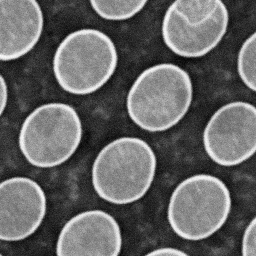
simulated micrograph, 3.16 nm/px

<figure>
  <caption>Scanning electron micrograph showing raised bodies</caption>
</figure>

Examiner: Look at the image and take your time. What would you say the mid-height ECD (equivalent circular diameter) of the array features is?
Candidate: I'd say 190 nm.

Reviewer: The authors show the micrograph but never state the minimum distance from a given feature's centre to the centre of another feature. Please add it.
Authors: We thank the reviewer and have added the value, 257 nanometers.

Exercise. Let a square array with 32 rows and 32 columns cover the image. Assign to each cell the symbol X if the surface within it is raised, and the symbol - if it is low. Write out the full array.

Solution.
XXXX--------XXXXXX----XX-XXX----
XXXXX-------XXXXX----XXXX-XX----
XXXXX----------------XXXXXXX----
XXXXX----------------XXXXXXX----
XXXXX----XXXX--------XXXXXXX----
XXXX----XXXXXX-------XXXXXX----X
XXX----XXXXXXX--------XXXX----XX
-------XXXXXXX----------------XX
-------XXXXXXX-----XXX--------XX
-------XXXXXXX----XXXXX-------XX
--------XXXXX----XXXXXXX-------X
X---------------XXXXXXXX--------
X---------------XXXXXXXX--------
-----XXXX-------XXXXXXX-----XXXX
----XXXXX--------XXXXXX----XXXXX
---XXXXXXX-------XXXXX----XXXXXX
---XXXXXXX----------------XXXXXX
---XXXXXXX-----XX---------XXXXXX
---XXXXXX----XXXXXX-------XXXXXX
---XXXXXX---XXXXXXX--------XXXX-
-----XX-----XXXXXXX-------------
------------XXXXXXX-------------
--X---------XXXXXXX-----XXX-----
XXXXX-------XXXXXX----XXXXXX----
XXXXX--------XXXXX----XXXXXXX---
XXXXX----------------XXXXXXXX---
XXXXX----------------XXXXXXX----
XXXXX----XXXXX-------XXXXXXX----
XXXX----XXXXXXX-------XXXXX----X
XXX-----XXXXXXX--------XXX-----X
-------XXXXXXXX----------------X
-------XXXXXXXX-----XX---------X